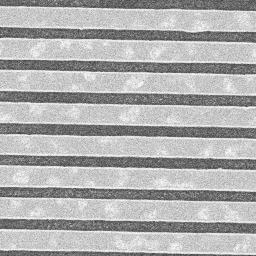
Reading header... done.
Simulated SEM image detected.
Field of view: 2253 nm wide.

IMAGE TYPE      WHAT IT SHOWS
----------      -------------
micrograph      parallel lines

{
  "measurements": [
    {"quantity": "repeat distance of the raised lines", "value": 280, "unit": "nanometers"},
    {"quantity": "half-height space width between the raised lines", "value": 0.103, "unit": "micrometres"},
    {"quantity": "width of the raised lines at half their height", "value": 178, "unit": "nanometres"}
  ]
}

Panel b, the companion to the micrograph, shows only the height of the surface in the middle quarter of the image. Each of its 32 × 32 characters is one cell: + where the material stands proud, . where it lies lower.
................................
................................
+++++++++++++++++++++++++++++...
++++++++++++++++++++++++++++++++
++++++++++++++++++++++++++++++++
++++++++++++++++++++++++++++++++
++++++++++++++++++++++++++++++++
................................
................................
................................
+++++++++++++++++++++++++..++...
++++++++++++++++++++++++++++++++
++++++++++++++++++++++++++++++++
++++++++++++++++++++++++++++++++
++++++++++++++++++++++++++++++++
................................
................................
................................
+++++++++++++++++++++++++++....+
++++++++++++++++++++++++++++++++
++++++++++++++++++++++++++++++++
++++++++++++++++++++++++++++++++
++++++++++++++++++++++++++++++++
................................
................................
................................
++++++++++++++++++++++++++++++++
++++++++++++++++++++++++++++++++
++++++++++++++++++++++++++++++++
++++++++++++++++++++++++++++++++
++++++++++++++++++++++++++++++++
................................